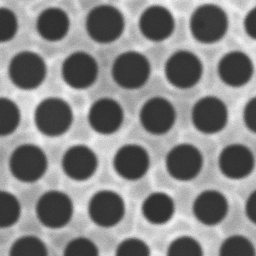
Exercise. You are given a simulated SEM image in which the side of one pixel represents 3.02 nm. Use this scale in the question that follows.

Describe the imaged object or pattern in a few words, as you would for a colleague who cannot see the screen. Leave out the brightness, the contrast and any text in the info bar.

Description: a regular array of holes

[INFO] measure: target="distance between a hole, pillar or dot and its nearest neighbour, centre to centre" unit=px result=52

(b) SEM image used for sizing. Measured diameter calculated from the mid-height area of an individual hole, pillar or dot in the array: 0.114 µm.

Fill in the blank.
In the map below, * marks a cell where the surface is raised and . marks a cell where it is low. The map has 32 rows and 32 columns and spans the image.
**************************.*****
..***...***....***...***....***.
..***....**.....*.....**.....*..
..***....**.....*.....**.....*..
..***...***....***...***....***.
********************************
**..*****..*****.*****..*****.**
*....***....**.....**....**....*
*.....**....**.....**....**.....
*.....**....**.....**....**.....
**...***....***...***....***...*
********************************
..***...****..****...****...***.
..**.....**....***....**....***.
...*.....**.....*.....**.....*..
..**.....**....***....**....***.
..***...****..****...****..****.
********************************
**...****..****...****...***...*
*.....**....**.....**....**.....
*.....**....**.....**....**.....
*.....**....***...***....***...*
**...****..*****.*****..********
********************************
..***...****...****..****...***.
..***....**.....**....**.....**.
...**....**.....**....**.....**.
..***....**....***...****...***.
.*****..*****.******************
***.*************************.**
**....**....***...***....***....
*.....**....**.....**....**.....